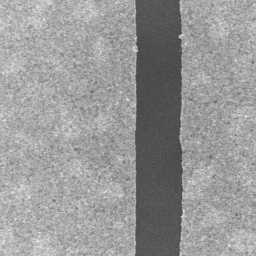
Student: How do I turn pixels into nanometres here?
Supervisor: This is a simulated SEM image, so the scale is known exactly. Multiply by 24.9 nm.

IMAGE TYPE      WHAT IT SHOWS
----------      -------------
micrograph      one or a few lines or trenches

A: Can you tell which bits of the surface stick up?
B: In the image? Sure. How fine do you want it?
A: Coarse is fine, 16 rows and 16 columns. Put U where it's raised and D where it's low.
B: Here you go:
UUUUUUUUDDDUUUUU
UUUUUUUUDDDUUUUU
UUUUUUUUUDDUUUUU
UUUUUUUUUDDUUUUU
UUUUUUUUDDDUUUUU
UUUUUUUUDDDUUUUU
UUUUUUUUDDDUUUUU
UUUUUUUUDDDUUUUU
UUUUUUUUDDDUUUUU
UUUUUUUUDDDUUUUU
UUUUUUUUDDDUUUUU
UUUUUUUUDDDUUUUU
UUUUUUUUDDDUUUUU
UUUUUUUUDDDUUUUU
UUUUUUUUDDDUUUUU
UUUUUUUUDDDUUUUU